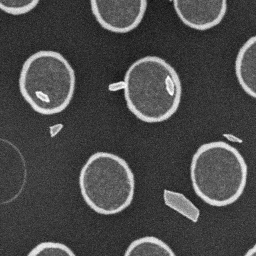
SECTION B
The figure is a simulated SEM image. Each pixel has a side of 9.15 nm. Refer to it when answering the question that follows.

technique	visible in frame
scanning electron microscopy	raised bodies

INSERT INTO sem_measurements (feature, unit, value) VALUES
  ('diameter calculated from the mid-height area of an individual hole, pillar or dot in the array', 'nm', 506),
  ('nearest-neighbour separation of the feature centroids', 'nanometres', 945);